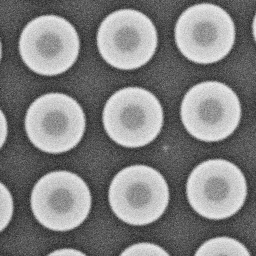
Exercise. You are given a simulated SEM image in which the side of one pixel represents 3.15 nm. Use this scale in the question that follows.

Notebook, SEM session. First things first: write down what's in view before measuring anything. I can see an array of small figures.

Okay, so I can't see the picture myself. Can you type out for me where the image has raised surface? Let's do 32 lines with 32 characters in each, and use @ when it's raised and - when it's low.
--------------------------------
---------------@@------@@@@@----
----@@@@-----@@@@@@---@@@@@@@---
---@@@@@@---@@@@@@@---@@@@@@@---
---@@@@@@@--@@@@@@@@--@@@@@@@---
--@@@@@@@@--@@@@@@@@--@@@@@@@---
---@@@@@@@---@@@@@@----@@@@@----
---@@@@@@----@@@@@@-----@@@-----
----@@@@@------@@---------------
--------------------------------
-------------------------@@@----
---------------@@@@-----@@@@@---
-----@@@@-----@@@@@@---@@@@@@@--
----@@@@@@---@@@@@@@---@@@@@@@--
---@@@@@@@---@@@@@@@---@@@@@@@--
@--@@@@@@@@--@@@@@@@---@@@@@@@--
@--@@@@@@@---@@@@@@@----@@@@@---
@---@@@@@@----@@@@@------@@-----
-----@@@@-----------------------
--------------------------------
-------------------------@@@@---
-------@-------@@@@@----@@@@@@--
-----@@@@@----@@@@@@----@@@@@@@-
@---@@@@@@@---@@@@@@@--@@@@@@@@-
@---@@@@@@@---@@@@@@@--@@@@@@@@-
@@--@@@@@@@---@@@@@@@---@@@@@@--
@@--@@@@@@@---@@@@@@-----@@@@---
@----@@@@@-----@@@@-------------
------@@@-----------------------
--------------------------------
-----------------@@-------@@@@--
-------@@@------@@@@@----@@@@@@-